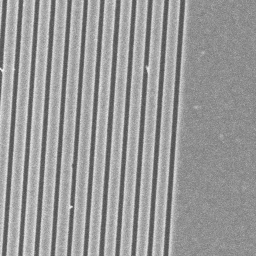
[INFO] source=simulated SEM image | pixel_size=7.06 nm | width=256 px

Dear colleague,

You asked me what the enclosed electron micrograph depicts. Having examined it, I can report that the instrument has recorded parallel lines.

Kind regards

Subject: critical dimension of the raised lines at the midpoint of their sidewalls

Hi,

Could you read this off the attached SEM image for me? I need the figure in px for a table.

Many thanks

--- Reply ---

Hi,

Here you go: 11.5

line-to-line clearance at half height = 0.037 microns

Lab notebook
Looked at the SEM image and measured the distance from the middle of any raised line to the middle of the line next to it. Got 114 nm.